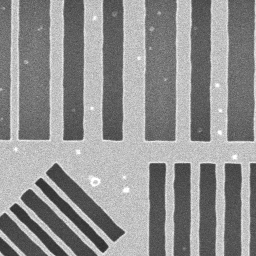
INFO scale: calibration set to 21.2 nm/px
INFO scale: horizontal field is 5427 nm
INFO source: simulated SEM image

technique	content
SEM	groups of lines, slits or small figures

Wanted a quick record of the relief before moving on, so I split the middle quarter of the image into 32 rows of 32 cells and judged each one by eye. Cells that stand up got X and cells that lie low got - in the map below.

-----XXXX------XXXXX--------XXXX
-----XXXX------XXXXX--------XXXX
-----XXXXX-----XXXXX--------XXXX
-----XXXXX-----XXXXX--------XXXX
-----XXXXX-----XXXXX--------XXXX
-----XXXX------XXXXX--------XXXX
-----XXXX------XXXXX--------XXXX
-----XXXX------XXXXX--------XXXX
-----XXXX------XXXXX--------XXXX
-----XXXX------XXXXX--------XXXX
-----XXXX------XXXXX--------XXXX
-----XXXX------XXXXX--------XXXX
-----XXXX------XXXXX--------XXXX
-----XXXX------XXXXX--------XXXX
-----XXXX------XXXXX--------XXXX
-----XXXX------XXXXX--------XXXX
-----XXXX------XXXXX--------XXXX
-----XXXX------XXXXX--------XXXX
-----XXXX------XXXXX--------XXXX
XXXXXXXXXXXXXXXXXXXXX-XXX---XXXX
XXXXXXXXXXXXXXXXXXXXXXXXXXXXXXXX
XXXXXXXXXXXXXXXXXXXXXXXXXXXXXXXX
XXXXXXXXXXXXXXXXXXXXXXXXXXXXXXXX
XXXXXXXXXXXXXXXXXXXXXXXXXXXXXXXX
XXXXXXXXXXXXXXXXXXXXXXXXXXXXXXXX
XXXXXXXXXXXXXXXXXXXXX-----X-----
XXXXXXXXXXXXXXXXXXXXX-----X-----
-XXXXXXXXXXXXXXXXXXXX----XXX----
--XXXXXXXXXXXXXXXXXXX----XX-----
---XXXXXXXXXXXXXXXXXX----XX-----
----XXXXXXXXXXXXXXXXX----XX-----
-----XXXXXXXXXXXXXXXX----XX-----